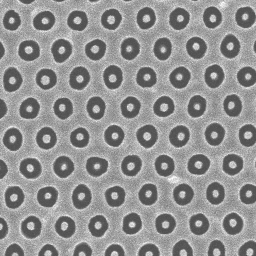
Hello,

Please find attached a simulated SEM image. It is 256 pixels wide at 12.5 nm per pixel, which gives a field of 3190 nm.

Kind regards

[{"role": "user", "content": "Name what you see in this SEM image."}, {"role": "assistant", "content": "a regular array of ring-shaped grooves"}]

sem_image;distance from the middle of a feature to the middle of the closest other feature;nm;410